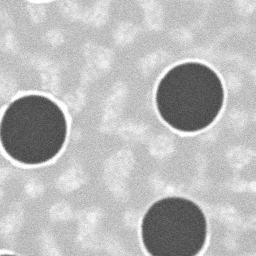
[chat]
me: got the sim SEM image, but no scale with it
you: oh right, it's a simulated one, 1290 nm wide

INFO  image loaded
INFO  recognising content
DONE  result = holes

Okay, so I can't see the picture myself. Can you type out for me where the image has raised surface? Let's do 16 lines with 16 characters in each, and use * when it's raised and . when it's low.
****************
****************
****************
****************
***********..***
**********....**
*..*******....**
....******...***
....************
....************
****************
****************
**********..****
*********....***
*********....***
*********....***